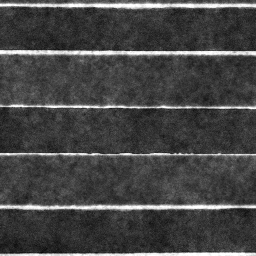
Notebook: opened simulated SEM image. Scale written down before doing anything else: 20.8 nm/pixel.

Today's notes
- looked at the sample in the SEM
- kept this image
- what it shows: lines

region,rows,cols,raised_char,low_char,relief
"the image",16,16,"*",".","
................
................
................
****************
****************
****************
****************
................
................
................
****************
****************
****************
................
................
................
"